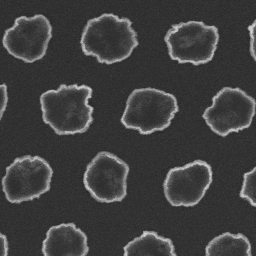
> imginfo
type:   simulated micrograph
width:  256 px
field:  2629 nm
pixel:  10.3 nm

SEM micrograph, a regular array of raised bodies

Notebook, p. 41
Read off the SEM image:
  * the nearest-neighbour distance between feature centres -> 821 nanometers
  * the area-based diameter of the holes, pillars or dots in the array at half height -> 474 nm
